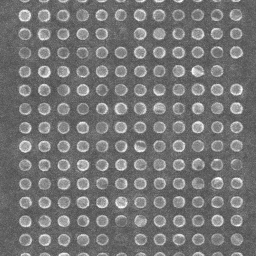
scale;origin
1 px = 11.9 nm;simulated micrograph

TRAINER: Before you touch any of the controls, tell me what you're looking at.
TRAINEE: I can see a regular array of raised bodies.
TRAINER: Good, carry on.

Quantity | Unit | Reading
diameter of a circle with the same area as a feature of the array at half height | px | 11.7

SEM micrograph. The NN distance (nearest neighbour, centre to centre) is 221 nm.